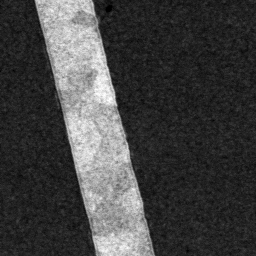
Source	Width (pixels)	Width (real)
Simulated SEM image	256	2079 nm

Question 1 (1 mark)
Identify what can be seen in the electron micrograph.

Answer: one or a few lines or trenches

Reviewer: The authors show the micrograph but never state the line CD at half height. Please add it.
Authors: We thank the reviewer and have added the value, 0.445 µm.